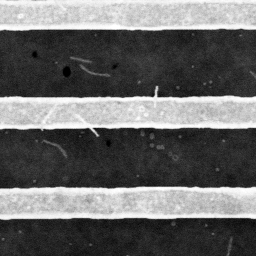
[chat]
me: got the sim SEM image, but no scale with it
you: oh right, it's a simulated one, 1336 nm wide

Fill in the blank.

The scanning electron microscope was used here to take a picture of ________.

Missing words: lines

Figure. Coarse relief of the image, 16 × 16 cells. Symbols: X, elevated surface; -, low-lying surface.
XXXXXXXXXXXXXXXX
XXXXXXXXXXXXXXXX
----------------
----------------
----------------
----------------
XXXXXXXXXXXXXXXX
XXXXXXXXXXXXXXXX
----------------
----------------
----------------
----------------
XXXXXXXXXXXXXXXX
XXXXXXXXXXXXXXXX
----------------
----------------